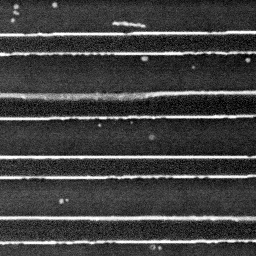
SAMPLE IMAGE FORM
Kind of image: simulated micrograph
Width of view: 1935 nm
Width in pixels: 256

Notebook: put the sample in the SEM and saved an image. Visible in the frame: lines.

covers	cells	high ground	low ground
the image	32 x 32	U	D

DDDDDDDDDDDDDDDDDDDDDDDDDDDDDDDD
DDDDDDDDDDDDDDDDDDDDDDDDDDDDDDDD
DDDDDDDDDDDDDDDDDDDDDDDDDDDDDDDD
DDDDDDDDDDDDDDDDDDDDDDDDDDDDDDDD
UUUUUUUUUUUUUUUUUUUUUUUUUUUUUUUU
UUUUUUUUUUUUUUUUUUUUUUUUUUUUUUUU
UUUUUUUUUUUUUUUUUUUUUUUUUUUUUUUU
DDDDDDDDDDDDDDDDDDDDDDDDDDDDDDDD
DDDDDDDDDDDDDDDDDDDDDDDDDDDDDDDD
DDDDDDDDDDDDDDDDDDDDDDDDDDDDDDDD
DDDDDDDDDDDDDDDDDDDDDDDDDDDDDDDD
DDDDDDDDDDDDDDDDDDDDDDDDDDDDDDDD
UUUUUUUUUUUUUUUUUUUUUUUUUUUUUUUU
UUUUUUUUUUUUUUUUUUUUUUUUUUUUUUUU
UUUUUUUUUUUUUUUUUUUUUUUUUUUUUUUD
DDDDDDDDDDDDDDDDDDDDDDDDDDDDDDDD
DDDDDDDDDDDDDDDDDDDDDDDDDDDDDDDD
DDDDDDDDDDDDDDDDDDDDDDDDDDDDDDDD
DDDDDDDDDDDDDDDDDDDDDDDDDDDDDDDD
DDDDDDDDDDDDDDDDDDDDDDDDDDDDDDDD
UUUUUUUUUUUUUUUUUUUUUUUUUUUUUUUU
UUUUUUUUUUUUUUUUUUUUUUUUUUUUUUUU
DDDDDDDDDDDDDDDDDDDDDDDDDDDDDDDD
DDDDDDDDDDDDDDDDDDDDDDDDDDDDDDDD
DDDDDDDDDDDDDDDDDDDDDDDDDDDDDDDD
DDDDDDDDDDDDDDDDDDDDDDDDDDDDDDDD
DDDDDDDDDDDDDDDDDDDDDDDDDDDDDDDD
UUUUUUUUUUUUUUUUUUUUUUUUUUUUUUUU
UUUUUUUUUUUUUUUUUUUUUUUUUUUUUUUU
UUUUUUUUUUUUUUUUUUUUUUUUUUUUUUUU
DDDDDDDDDDDDDDDDDDDDDDDDDDDDDDDD
DDDDDDDDDDDDDDDDDDDDDDDDDDDDDDDD